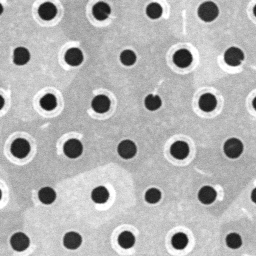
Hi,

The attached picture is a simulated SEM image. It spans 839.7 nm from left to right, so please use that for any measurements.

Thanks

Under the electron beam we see a regular array of holes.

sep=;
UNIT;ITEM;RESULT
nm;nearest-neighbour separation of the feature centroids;170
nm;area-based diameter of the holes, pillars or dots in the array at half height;64.9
